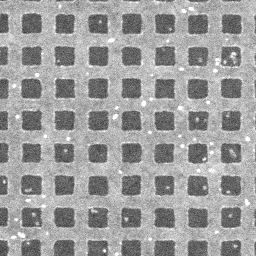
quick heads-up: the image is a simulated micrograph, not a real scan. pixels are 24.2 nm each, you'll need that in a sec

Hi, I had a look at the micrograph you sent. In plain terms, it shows a regular array of raised bodies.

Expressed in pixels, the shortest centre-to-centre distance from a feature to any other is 32.1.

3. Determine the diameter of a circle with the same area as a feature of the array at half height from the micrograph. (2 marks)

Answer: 561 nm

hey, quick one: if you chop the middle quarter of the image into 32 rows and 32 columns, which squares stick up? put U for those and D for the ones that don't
UUDDDDUDUUUDDDDUUDDDDDDUDUUDDDDU
DDDDDDDDDDDDDDDDDDDDDDDDDDDDDDDD
DDDDDDDDDDDDDDDDDDDDDDDDDDDDDDDD
DDDDDDDDUDDDDDDDUUDDDDDDDDDDDDDD
UUUDDDUUUUUDDDUUUUUDDDDUUUUUDDDU
UUUDDDUUUUUDDDUUUUUDDDDUUUUUDDDU
UUUDDDUUUUUDDDUUUUUDDDDUUUUUDDDU
UUUDDDUUUUUDDDUUUUUDDDDUUUUUDDDU
UUUDDDUUUUUDDDDUUUUDDDDUUDUDDDDU
DDDDDDDDDDDDDDDDDDDDDDDDDDDDDDDD
DDDDDDDDDDDDDDDDDDDDDDDDDDDDDDDD
DDDDDDDDDDDDDDDDDDDDDDDDDDDDDDDD
UUUDDDUUUUUDDDDUUUUDDDDUUUUUDDDU
UUUDDDUUUUUDDDUUUUUDDDDUUUUUDDDU
UUUDDDUUUUUDDDUUUUUDDDDUUUUUDDDU
UUUDDDUUUUUDDDUUUUUDDDDUUUUUDDDU
UUDDDDUUUUUDDDDUUUUDDDDUUUUDDDDU
DDDDDDDDDDDDDDDDDDDDDDDDDDDDDDDD
DDDDDDDDDDDDDDDDDDDDDDDDDDDDDDDD
DDDDDDDDDDDDDDDDDDDDDDDDDDDDDDDD
UUUDDDUUUUUDDDUUUUUDDDDUUUUUDDDU
UUUDDDUUUUUDDDUUUUUDDDDUUUUUDDDU
UUUDDDUUUUUDDDUUUUUDDDDUUUUDDDDU
UUUDDDUUUUUDDDDUUUUDDDDUUUUDDDDU
UUDDDDDUUUUDDDDUUUUDDDDUUUUDDDDU
DDDDDDDDDDDDDDDDDDDDDDDDDDDDDDDD
DDDDDDDDDDDDDDDDDDDDDDDDDDDDDDDD
DDDDDDDDDDDDDDDDDDDDDDDDDDDDDDDD
UUUDDDUUUUUDDDUUUUUDDDDUUUUUDDDU
UUUDDDUUUUUDDDUUUUUDDDDUUUUUDDDU
UUUDDDUUUUUDDDUUUUUDDDDUUUUUDDDU
UUDDDDUUUUUDDDUUUUUDDDDUUUUUDDDU